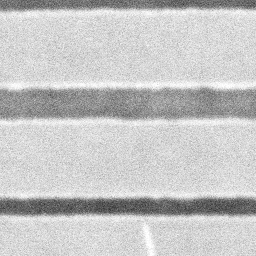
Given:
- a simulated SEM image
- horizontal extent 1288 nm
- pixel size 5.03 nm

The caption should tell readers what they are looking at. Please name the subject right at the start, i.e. lines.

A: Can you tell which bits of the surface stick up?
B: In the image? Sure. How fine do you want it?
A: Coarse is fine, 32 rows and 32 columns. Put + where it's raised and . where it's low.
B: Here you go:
................................
.....+.+++++++++++++++++++++++++
++++++++++++++++++++++++++++++++
++++++++++++++++++++++++++++++++
++++++++++++++++++++++++++++++++
++++++++++++++++++++++++++++++++
++++++++++++++++++++++++++++++++
++++++++++++++++++++++++++++++++
++++++++++++++++++++++++++++++++
++++++++++++++++++++++++++++++++
++++++++++++++++++++++++++++++++
................................
................................
................................
................................
++++++++++++++++++++++++++++++++
++++++++++++++++++++++++++++++++
++++++++++++++++++++++++++++++++
++++++++++++++++++++++++++++++++
++++++++++++++++++++++++++++++++
++++++++++++++++++++++++++++++++
++++++++++++++++++++++++++++++++
++++++++++++++++++++++++++++++++
++++++++++++++++++++++++++++++++
++++++++++++++++++.+++++++.+++..
................................
................................
++++++++++++++++++++++++++++++++
++++++++++++++++++++++++++++++++
++++++++++++++++++++++++++++++++
++++++++++++++++++++++++++++++++
++++++++++++++++++++++++++++++++